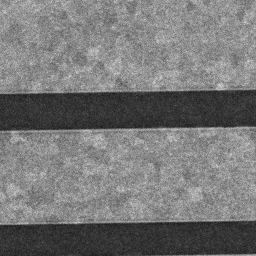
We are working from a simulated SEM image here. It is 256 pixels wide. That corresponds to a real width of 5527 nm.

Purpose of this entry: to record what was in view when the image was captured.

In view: one or a few lines or trenches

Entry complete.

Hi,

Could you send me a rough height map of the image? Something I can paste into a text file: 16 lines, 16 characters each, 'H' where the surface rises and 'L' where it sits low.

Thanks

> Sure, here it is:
HHHHHHHHHHHHHHHH
HHHHHHHHHHHHHHHH
HHHHHHHHHHHHHHHH
HHHHHHHHHHHHHHHH
HHHHHHHHHHHHHHHH
HHHHHHHHHHHHHHHH
LLLLLLLLLLLLLLLL
LLLLLLLLLLLLLLLL
HHHHHHHHHHHHHHHH
HHHHHHHHHHHHHHHH
HHHHHHHHHHHHHHHH
HHHHHHHHHHHHHHHH
HHHHHHHHHHHHHHHH
HHHHHHHHHHHHHHHH
LLLLLLLLLLLLLLLL
LLLLLLLLLLLLLLLL